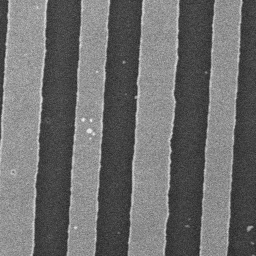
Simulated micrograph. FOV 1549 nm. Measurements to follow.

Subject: lines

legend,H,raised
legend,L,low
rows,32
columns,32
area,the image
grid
LHHHHHLLLLHHHHLLLLHHHHLLLLLHHHLL
LHHHHHLLLLHHHHLLLLHHHHLLLLLHHHLL
LHHHHHLLLLHHHLLLLLHHHHLLLLLHHHLL
LHHHHHLLLLHHHLLLLLHHHHLLLLLHHHLL
LHHHHHLLLLHHHLLLLLHHHHLLLLLHHHLL
LHHHHHLLLLHHHLLLLLHHHHLLLLLHHHLL
LHHHHHLLLLHHHLLLLHHHHHLLLLHHHHLL
LHHHHHLLLLHHHLLLLHHHHHLLLLHHHHLL
LHHHHLLLLLHHHLLLLHHHHHLLLLHHHHLL
LHHHHLLLLLHHHLLLLHHHHHLLLLHHHHLL
HHHHHLLLLLHHHLLLLHHHHHLLLLHHHHLL
HHHHHLLLLLHHHLLLLHHHHHLLLLHHHHLL
HHHHHLLLLLHHHLLLLHHHHHLLLLHHHLLL
HHHHHLLLLLHHHLLLLHHHHHLLLLHHHLLL
HHHHHLLLLHHHHLLLLHHHHHLLLLHHHLLL
HHHHHLLLLHHHHLLLLHHHHHLLLLHHHLLL
HHHHHLLLLHHHHLLLLHHHHHLLLLHHHLLL
HHHHHLLLLHHHHLLLLHHHHLLLLLHHHLLL
HHHHHLLLLHHHHLLLLHHHHLLLLLHHHLLL
HHHHHLLLLHHHHLLLLHHHHLLLLLHHHLLL
HHHHHLLLLHHHHLLLLHHHHLLLLLHHHLLL
HHHHHLLLLHHHLLLLLHHHHLLLLLHHHLLL
HHHHLLLLLHHHLLLLLHHHHLLLLLHHHLLL
HHHHLLLLLHHHLLLLLHHHHLLLLHHHHLLL
HHHHLLLLLHHHLLLLHHHHHLLLLHHHHLLL
HHHHLLLLLHHHLLLLHHHHHLLLLHHHHLLL
HHHHLLLLLHHHLLLLHHHHHLLLLHHHHLLL
HHHHLLLLLHHHLLLLHHHHHLLLLHHHHLLL
HHHHLLLLLHHHLLLLHHHHHLLLLHHHHLLL
HHHHLLLLLHHHLLLLHHHHHLLLLHHHLLLL
HHHHLLLLLHHHLLLLHHHHHLLLLHHHLLLL
HHHHLLLLHHHHLLLLHHHHHLLLLHHHLLLL